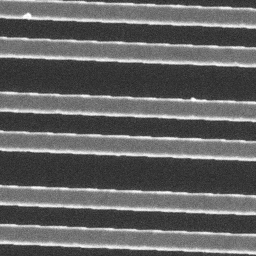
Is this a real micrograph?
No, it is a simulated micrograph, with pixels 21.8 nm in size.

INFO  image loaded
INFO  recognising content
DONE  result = lines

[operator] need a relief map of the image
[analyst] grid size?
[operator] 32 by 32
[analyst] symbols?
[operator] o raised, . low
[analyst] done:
ooooooooooooooooo...............
oooooooooooooooooooooooooooooooo
.......ooooooooooooooooooooooooo
................................
................................
oooooooooooooooooo..............
oooooooooooooooooooooooooooooooo
............oooooooooooooooooooo
................................
................................
................................
................................
ooooooooooooooooooooooooo.......
oooooooooooooooooooooooooooooooo
.................ooooooooooooooo
................................
o...............................
ooooooooooooooooooooooooooooo...
oooooooooooooooooooooooooooooooo
...................ooooooooooooo
................................
................................
................................
oooooo..........................
oooooooooooooooooooooooooooooooo
.ooooooooooooooooooooooooooooooo
.........................ooooooo
................................
ooooooooooo.....................
oooooooooooooooooooooooooooooooo
...ooooooooooooooooooooooooooooo
..............................oo